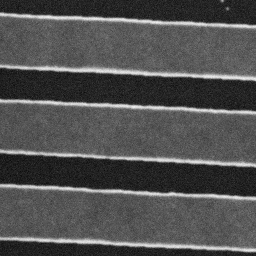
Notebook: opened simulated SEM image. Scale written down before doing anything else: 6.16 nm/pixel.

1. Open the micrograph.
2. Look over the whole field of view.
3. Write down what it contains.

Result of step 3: lines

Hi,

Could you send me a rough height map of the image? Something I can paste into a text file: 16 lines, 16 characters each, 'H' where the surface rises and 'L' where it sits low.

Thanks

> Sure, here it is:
LLLLLLLLLLLLLLLL
HHHHHHHHHHHHHLLL
HHHHHHHHHHHHHHHH
HHHHHHHHHHHHHHHH
LLLLLLHHHHHHHHHH
LLLLLLLLLLLLLLLL
HHHHHLLLLLLLLLLL
HHHHHHHHHHHHHHHH
HHHHHHHHHHHHHHHH
HHHHHHHHHHHHHHHH
LLLLLLLLLLLLLLLL
LLLLLLLLLLLLLLLL
HHHHHHHHHHHHHHHH
HHHHHHHHHHHHHHHH
HHHHHHHHHHHHHHHH
LLLLLLLLLLLLHHHH